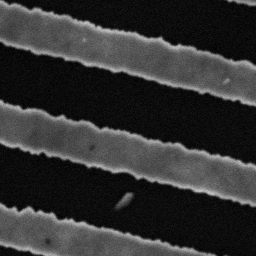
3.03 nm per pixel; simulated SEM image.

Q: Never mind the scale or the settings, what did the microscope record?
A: lines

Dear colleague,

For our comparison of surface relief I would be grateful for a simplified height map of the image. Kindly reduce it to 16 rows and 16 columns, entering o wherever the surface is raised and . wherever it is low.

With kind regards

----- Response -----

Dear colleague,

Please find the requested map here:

oo..............
oooooo..........
oooooooooo......
...ooooooooooo..
.......ooooooooo
...........ooooo
o..............o
oooo............
ooooooooo.......
..ooooooooooo...
......oooooooooo
..........oooooo
..............oo
ooo.............
oooooooo........
.ooooooooooo....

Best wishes